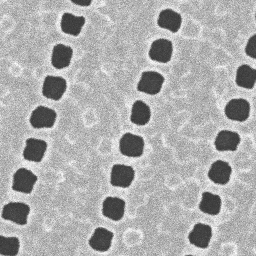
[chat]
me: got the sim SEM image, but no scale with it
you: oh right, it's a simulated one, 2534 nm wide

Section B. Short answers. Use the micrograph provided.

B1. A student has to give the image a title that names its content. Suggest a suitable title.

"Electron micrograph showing a regular array of holes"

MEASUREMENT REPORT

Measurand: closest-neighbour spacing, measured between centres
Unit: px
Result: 32.3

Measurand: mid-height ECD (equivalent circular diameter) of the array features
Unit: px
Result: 24.6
